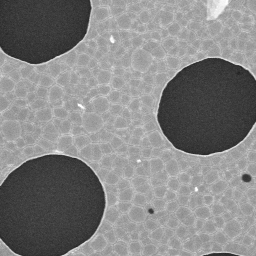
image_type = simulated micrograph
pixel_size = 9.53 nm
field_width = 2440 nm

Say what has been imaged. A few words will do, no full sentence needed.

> holes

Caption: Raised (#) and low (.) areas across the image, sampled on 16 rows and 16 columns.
......##########
......##########
.....###########
#...############
###########.....
##########......
##########......
##########......
##########.....#
############..##
#.....##########
......##########
.......#########
......##########
......##########
#....###########